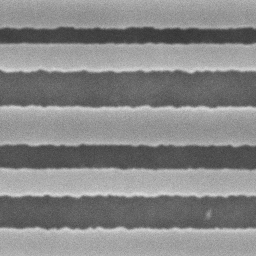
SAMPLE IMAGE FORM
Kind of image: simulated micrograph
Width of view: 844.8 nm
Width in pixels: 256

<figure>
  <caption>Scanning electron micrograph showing lines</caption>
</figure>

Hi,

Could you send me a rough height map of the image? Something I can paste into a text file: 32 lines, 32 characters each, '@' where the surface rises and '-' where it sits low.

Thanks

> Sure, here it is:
@@@@@@@@@@@@@@@@@@@@@@@@@@@@@@@@
@@@@@@@@@@@@@@@@@@@@@@@@@@@@@@@@
@@@@@@@@@@@@@@@@@@@@@@@@@@@@@@@@
--@-@@@--@@@-@@@---@@@@@-@@@@@--
--------------------------------
--@----------@----@-------------
@@@@@@@@@@@@@@@@@@@@@@@@@@@@@@@@
@@@@@@@@@@@@@@@@@@@@@@@@@@@@@@@@
@@@@@@@@@@@@@@@@@@@@@@@@@@@@@@@@
--------------------------------
--------------------------------
--------------------------------
--------------------------------
@@@@@@@@@@@@@@@@@@@@@@@@@@-@@@@@
@@@@@@@@@@@@@@@@@@@@@@@@@@@@@@@@
@@@@@@@@@@@@@@@@@@@@@@@@@@@@@@@@
@@@@@@@@@@@@@@@@@@@@@@@@@@@@@@@@
@@@@@@@@@@@@@@@@@@@@@@@@@@@@@@@@
--------------------------------
--------------------------------
--------------------------------
@@@@@@@@@@@@@@@@@@@@@@@@@@@@@@@@
@@@@@@@@@@@@@@@@@@@@@@@@@@@@@@@@
@@@@@@@@@@@@@@@@@@@@@@@@@@@@@@@@
-@@----@-@------@-@-----@@@-----
--------------------------------
--------------------------------
--------------------------------
------------@-------------------
@@@@@@@@@@@@@@@@@@@@@@@@@@@@@@@@
@@@@@@@@@@@@@@@@@@@@@@@@@@@@@@@@
@@@@@@@@@@@@@@@@@@@@@@@@@@@@@@@@